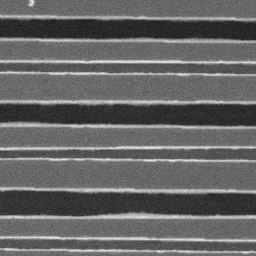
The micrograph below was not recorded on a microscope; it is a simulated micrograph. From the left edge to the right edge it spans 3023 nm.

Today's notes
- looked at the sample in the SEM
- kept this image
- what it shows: lines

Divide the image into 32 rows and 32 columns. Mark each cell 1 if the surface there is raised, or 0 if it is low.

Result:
11111111111111111111111111111111
11111111111111111111111111111111
00000000000000000000000000000000
00000000000000000000000000000000
00000000000000000000000000000000
11111111111111111111111111111111
11111111111111111111111111111111
11111111111111111111111111111111
11111111111111111111111111111111
11111111111111111111111111111111
11111111111111111111111111111111
11111111111111111111111111111111
11111111111111111111111111111111
00000000000000000000000000000000
00000000000000000000000000000000
00000000000000000000000000000000
11111111111111111111111111111111
11111111111111111111111111111111
11111111111111111111111111111111
11111111111111111111111111111111
11111111111111111111111111111111
11111111111111111111111111111111
11111111111111111111111111111111
11111111111111111111111111111111
00000000000000000000000000000000
00000000000000000000000000000000
00000000000000000000000000000000
11111111111111111111111111111111
11111111111111111111111111111111
11111111111111111111111111111111
11111111111111111111111111111111
11111111111111111111111111111111